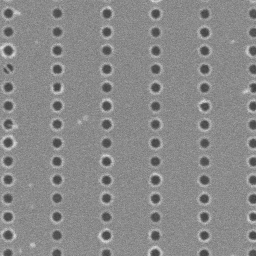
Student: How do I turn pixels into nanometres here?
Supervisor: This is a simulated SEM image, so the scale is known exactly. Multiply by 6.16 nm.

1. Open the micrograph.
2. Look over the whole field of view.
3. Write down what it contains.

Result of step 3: a regular array of holes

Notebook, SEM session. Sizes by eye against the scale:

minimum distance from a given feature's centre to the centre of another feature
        112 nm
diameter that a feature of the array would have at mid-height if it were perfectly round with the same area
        63.7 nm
